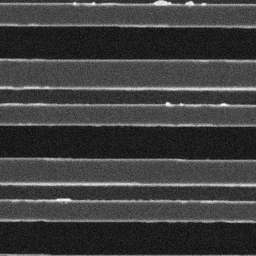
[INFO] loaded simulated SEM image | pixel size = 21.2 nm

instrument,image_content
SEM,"lines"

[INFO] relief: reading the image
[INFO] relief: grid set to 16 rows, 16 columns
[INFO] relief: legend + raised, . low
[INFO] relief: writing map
++++++++++++++++
++++++++++++++++
................
................
++++++++++++++++
++++++++++++++++
++++++++++++++++
++++++++++++++++
................
................
++++++++++++++++
++++++++++++++++
++++++++++++++++
++++++++++++++++
................
................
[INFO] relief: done